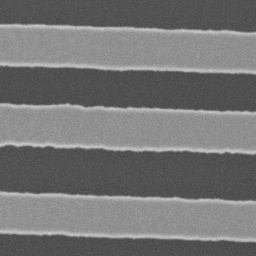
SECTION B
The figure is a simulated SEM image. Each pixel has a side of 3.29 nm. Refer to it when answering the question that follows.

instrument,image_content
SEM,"lines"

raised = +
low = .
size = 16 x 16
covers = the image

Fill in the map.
................
................
++++++++++++++++
++++++++++++++++
............++++
................
................
++++++++++++++++
++++++++++++++++
............++++
................
................
++++++++++++++..
++++++++++++++++
++++++++++++++++
................